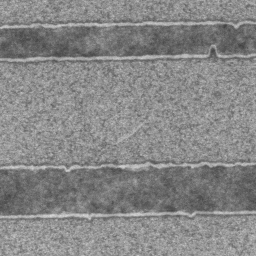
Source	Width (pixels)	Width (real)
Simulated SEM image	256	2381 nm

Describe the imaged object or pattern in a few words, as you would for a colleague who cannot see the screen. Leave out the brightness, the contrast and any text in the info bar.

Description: one or a few lines or trenches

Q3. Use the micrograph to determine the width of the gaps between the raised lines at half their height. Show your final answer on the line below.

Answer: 1010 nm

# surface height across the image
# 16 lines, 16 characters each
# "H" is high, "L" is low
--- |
LLLLLLLLLLLLLLLL
LLLLLLLLHHHHHHLH
HHHHHHHHHHHHHHHH
HHHHHHHHHHHHHLHL
LLLLLLLLLLLLLLLL
LLLLLLLLLLLLLLLL
LLLLLLLLLLLLLLLL
LLLLLLLLLLLLLLLL
LLLLLLLLLLLLLLLL
LLLLLLLLLLLLLLLL
HHHHHHHHHHHHHHHH
HHHHHHHHHHHHHHHH
HHHHHHHHHHHHHHHH
HHHLLHLLLLLLLLLL
LLLLLLLLLLLLLLLL
LLLLLLLLLLLLLLLL